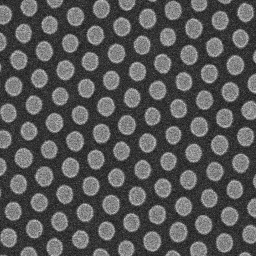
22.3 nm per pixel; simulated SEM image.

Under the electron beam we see a regular array of raised bodies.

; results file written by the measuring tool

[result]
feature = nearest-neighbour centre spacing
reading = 595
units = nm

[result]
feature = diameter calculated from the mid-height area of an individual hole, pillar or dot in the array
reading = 381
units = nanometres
